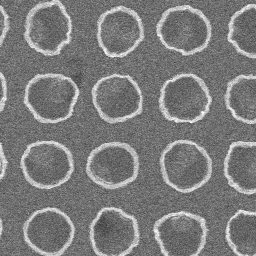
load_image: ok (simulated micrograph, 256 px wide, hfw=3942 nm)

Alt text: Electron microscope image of a regular array of raised bodies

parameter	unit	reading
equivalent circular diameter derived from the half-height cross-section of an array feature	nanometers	721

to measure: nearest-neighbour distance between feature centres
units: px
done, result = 65.8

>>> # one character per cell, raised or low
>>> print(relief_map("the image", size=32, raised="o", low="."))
......o.........................
....oooo......oo.....oooo.....oo
o...ooooo....oooo...oooooo...ooo
o...ooooo...oooooo..oooooo...ooo
...oooooo...oooooo..oooooo...ooo
....oooo.....oooo....ooooo...ooo
......o......ooo.......o......oo
................................
................................
..............o........o........
....ooooo...ooooo....oooo....ooo
o..ooooooo..ooooo...oooooo...ooo
...oooooo...oooooo..oooooo..oooo
....ooooo...ooooo...oooooo...ooo
.....ooo.....ooo.....oooo....ooo
................................
................................
................................
....oooo.....ooo.....oooo....ooo
...oooooo..oooooo...oooooo..oooo
...oooooo..oooooo...oooooo..oooo
...oooooo..oooooo....ooooo..oooo
....oooo....oooo.....ooooo...ooo
......................oo......oo
................................
................................
.....oo......oo.................
....ooooo...ooooo...ooooo....ooo
...oooooo..oooooo...ooooo...oooo
...oooooo..oooooo...ooooo...oooo
....oooo....ooooo...ooooo....ooo
.....ooo....oooo.....oooo.....oo